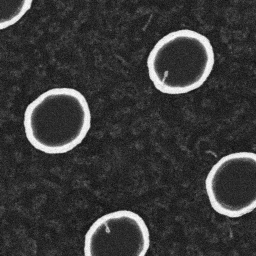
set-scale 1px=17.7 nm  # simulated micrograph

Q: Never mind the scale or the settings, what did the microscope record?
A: raised bodies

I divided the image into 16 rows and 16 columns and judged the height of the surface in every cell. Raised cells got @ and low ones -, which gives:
@@--------------
----------------
----------@@@---
----------@@@---
----------@@@---
----------@@----
--@@@-----------
--@@@-----------
--@@@-----------
----------------
-------------@@@
-------------@@@
-------------@@@
-------@--------
------@@@-------
-----@@@@-------